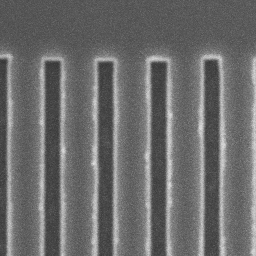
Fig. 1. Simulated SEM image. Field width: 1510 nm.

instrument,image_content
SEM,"parallel lines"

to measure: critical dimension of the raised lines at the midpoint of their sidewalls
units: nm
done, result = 209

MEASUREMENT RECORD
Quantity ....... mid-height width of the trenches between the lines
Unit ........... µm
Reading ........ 0.107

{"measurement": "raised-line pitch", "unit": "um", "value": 0.314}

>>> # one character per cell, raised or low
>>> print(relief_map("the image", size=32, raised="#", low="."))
################################
################################
################################
################################
################################
################################
################################
.#####.###################.#####
.####...####..#####..####..#####
.####...####..#####..####...####
.####...####..#####..####...####
.####...####..#####..####...####
.####...####..#####..####...####
.####...####..#####..####...####
.####...####..#####..####...####
.####...####..#####..####...####
.####...####..#####..####...####
.####...####..#####..####...####
.####...####..#####..####...####
.####...####..#####..####...####
.####...####..#####..####...####
.####...####..#####..####...####
.####...####..#####..####...####
.####...####..#####..####...####
.####...####..#####..####...####
.####...####..#####..####...####
.####...####..#####..####...####
.####...####..#####..####...####
.####...####..#####..####...####
.####...####..#####..####...####
.####...####..#####..####...####
.####...####..#####..####...####